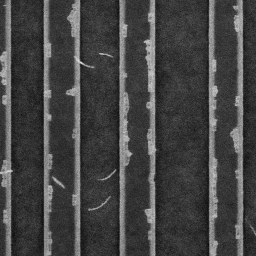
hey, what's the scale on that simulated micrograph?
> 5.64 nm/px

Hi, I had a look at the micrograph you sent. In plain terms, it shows one or a few lines or trenches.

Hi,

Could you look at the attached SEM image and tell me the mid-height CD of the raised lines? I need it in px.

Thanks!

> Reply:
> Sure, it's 31.6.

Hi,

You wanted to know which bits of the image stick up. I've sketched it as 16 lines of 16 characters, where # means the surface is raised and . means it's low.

#..##...##...##.
#..##...##...##.
#..##...##...##.
#..##...##...##.
#..##...##...##.
#..##...##...##.
#..##...##...##.
#..##...##...##.
#..##...##...##.
#..##...##...##.
#..##...##...##.
#..##...##...##.
#..##...##...##.
#..##...##...##.
#..##...##...##.
#..##...##...##.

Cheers